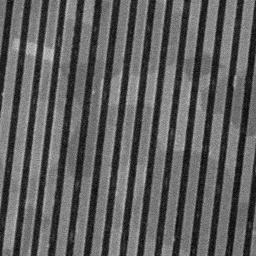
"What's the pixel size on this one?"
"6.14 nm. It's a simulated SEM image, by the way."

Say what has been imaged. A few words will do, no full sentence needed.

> parallel lines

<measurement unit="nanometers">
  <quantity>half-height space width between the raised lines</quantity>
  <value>48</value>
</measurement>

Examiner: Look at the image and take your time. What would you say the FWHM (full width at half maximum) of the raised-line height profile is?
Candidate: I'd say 0.0602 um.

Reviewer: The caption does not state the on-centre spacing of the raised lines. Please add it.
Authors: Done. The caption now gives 108 nm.